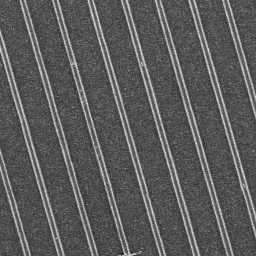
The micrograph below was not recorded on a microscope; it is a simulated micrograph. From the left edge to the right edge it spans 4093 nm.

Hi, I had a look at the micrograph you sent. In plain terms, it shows parallel lines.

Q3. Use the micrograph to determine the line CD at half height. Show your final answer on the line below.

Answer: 80.7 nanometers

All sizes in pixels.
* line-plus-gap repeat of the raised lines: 32.5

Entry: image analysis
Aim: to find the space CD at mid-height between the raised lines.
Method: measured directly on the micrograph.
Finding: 446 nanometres